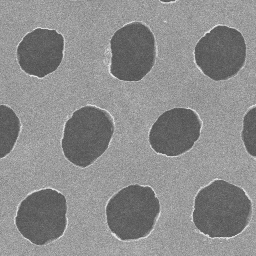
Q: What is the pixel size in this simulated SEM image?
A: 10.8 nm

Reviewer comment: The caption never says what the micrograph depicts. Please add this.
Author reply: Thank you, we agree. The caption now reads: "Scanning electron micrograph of a regular array of holes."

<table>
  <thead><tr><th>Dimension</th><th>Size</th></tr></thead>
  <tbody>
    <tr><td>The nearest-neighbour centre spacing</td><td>953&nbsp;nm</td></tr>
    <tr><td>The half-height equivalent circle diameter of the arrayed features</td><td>570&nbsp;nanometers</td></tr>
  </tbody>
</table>